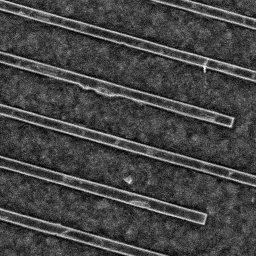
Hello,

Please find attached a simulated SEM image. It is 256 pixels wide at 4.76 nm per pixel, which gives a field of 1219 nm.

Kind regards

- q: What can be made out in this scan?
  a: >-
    parallel lines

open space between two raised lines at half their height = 0.191 micrometres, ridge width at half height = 9.75 px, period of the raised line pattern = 240 nanometers